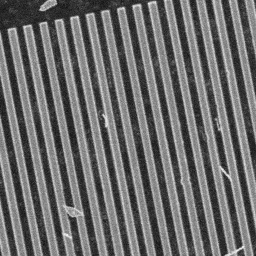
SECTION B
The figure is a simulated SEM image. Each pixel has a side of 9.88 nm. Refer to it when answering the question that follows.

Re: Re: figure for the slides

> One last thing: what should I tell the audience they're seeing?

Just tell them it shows parallel lines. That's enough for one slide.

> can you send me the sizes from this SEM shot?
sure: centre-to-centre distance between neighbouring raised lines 157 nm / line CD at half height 68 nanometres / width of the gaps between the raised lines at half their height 8.85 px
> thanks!